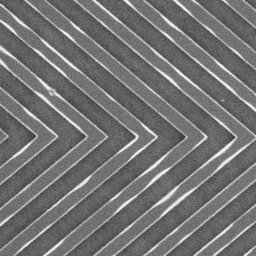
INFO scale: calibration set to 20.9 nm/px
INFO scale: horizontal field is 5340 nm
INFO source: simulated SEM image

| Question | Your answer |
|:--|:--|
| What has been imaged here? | groups of lines, slits or small figures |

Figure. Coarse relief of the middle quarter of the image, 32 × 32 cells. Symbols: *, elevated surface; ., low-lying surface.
**........*****.......*****.....
****.......*****........****....
*****.......*****........****...
.*****.......******.......*****.
..*****.......******.......*****
...*****........*****.......****
....******.......*****.......***
......*****.......*****.......**
.......*****.......*****.......*
*.......*****.......*****.......
**.......*****........*****.....
***........*****.......*****....
****........*****.......*****...
.****........*****.......*****..
..*****.......*****.......*****.
...*****.......*****........****
....*****.......*****........***
.....*****........****........**
.....******.......*****........*
....******.......*****.......***
...*****........*****.......****
..*****.......*****........*****
.*****.......*****........*****.
****........*****........*****..
***........*****........****....
**........*****.......*****.....
*.......*****........*****......
.......*****........****........
......*****........****........*
.....*****.......*****........**
....*****.......*****........***
...****........*****........****